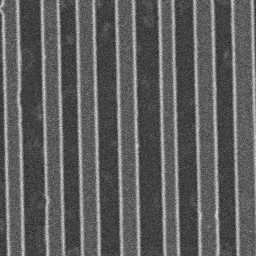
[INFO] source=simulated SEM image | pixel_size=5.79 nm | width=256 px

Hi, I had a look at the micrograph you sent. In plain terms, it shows parallel lines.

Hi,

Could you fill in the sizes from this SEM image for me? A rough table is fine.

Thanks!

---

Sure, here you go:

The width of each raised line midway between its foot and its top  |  99.9 nm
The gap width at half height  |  0.128 microns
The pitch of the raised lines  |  0.224 µm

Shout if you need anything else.